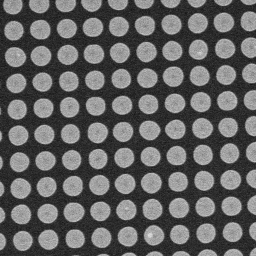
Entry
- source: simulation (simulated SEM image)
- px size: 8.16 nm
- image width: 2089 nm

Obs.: an array of small figures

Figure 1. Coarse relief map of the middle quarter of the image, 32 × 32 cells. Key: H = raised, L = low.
LLLLLLLLLLLLLLLLLLLLLLLLLLLLLLLL
LLLLLLLLLLLLLHHLLLLLHHLLLHHHHLLL
HHHLLLHHHHLLHHHHLLLHHHHLLHHHHHLL
HHHLLHHHHHLLHHHHHLHHHHHLLHHHHHLH
HHHLLHHHHHLLHHHHHLLHHHHLLHHHHLLL
HHHLLLHHHHLLLHHHLLLHHHLLLLLHLLLL
HHHLLLLLLLLLLLLLLLLLLLLLLLLLLLLL
LLLLLLLLLLLLLLLLLLLLLLLLLLLHLLLL
LHLLLLHHHLLLLHHHLLLHHHHLLLHHHHLL
HHHLLLHHHHLLHHHHHLLHHHHLLHHHHHLL
HHHHLLHHHHLLHHHHHLLHHHHLLHHHHHLL
HHHHLLHHHHLLHHHHHLLHHHHLLLHHHLLL
HHHLLLLHHLLLLLHHLLLLLLLLLLLLLLLL
LLLLLLLLLLLLLLLLLLLLLLLLLLLLLLLL
LLLLLLLLLLLLLLLLLLLLHHLLLLHHHHLL
HHHLLLHHHHLLLHHHHLLHHHHHLHHHHHLL
HHHHLLHHHHHLHHHHHLLHHHHHLHHHHHLL
HHHHLLHHHHHLHHHHHLLHHHHHLLHHHHLL
HHHHLLHHHHLLLHHHHLLLHHHLLLLHHLLL
HHHLLLLHHLLLLLLLLLLLLLLLLLLLLLLL
LLLLLLLLLLLLLLLLLLLLLLLLLLLLLLLL
LLLLLLLLHLLLLLHHHLLLHHHLLLHHHHLL
HHHHLLLHHHLLLHHHHLLHHHHHLLHHHHLL
HHHHLLHHHHHLLHHHHLLHHHHHLLHHHHLL
HHHHLLHHHHHLLHHHHLLLHHHHLLHHHHLL
HHHHLLLHHHLLLLHHLLLLLLLLLLLLLLLL
LLLLLLLLLLLLLLLLLLLLLLLLLLLLLLLL
LLLLLLLLLLLLLLLLLLLLLHHLLLLHHHLL
LHHHLLLHHHLLLHHHHLLLHHHHLLHHHHHL
HHHHLLHHHHHLLHHHHHLHHHHHLLHHHHHL
HHHHLLHHHHHLLHHHHHLHHHHHLLHHHHHL
HHHHHLLHHHHLLHHHHLLLHHHHLLLHHHLL